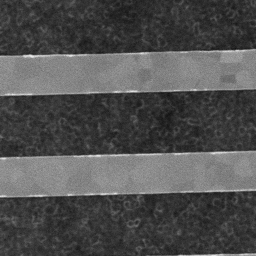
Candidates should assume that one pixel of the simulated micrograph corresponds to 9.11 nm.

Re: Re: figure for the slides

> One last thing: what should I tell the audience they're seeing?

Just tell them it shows one or a few lines or trenches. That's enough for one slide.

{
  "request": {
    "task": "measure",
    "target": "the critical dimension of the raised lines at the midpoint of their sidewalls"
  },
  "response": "357 nm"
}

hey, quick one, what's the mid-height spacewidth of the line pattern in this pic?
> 569 nanometres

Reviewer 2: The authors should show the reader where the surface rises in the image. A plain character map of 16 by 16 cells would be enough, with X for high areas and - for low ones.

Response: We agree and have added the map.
----------------
----------------
----------------
-XXXXXXXXXXXXXXX
XXXXXXXXXXXXXXXX
XXXXXXXXXXXXXXXX
----------------
----------------
----------------
---------------X
XXXXXXXXXXXXXXXX
XXXXXXXXXXXXXXXX
----------------
----------------
----------------
----------------